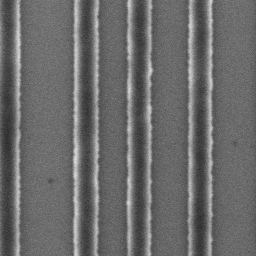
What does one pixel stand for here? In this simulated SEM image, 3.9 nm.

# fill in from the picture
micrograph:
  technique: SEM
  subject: lines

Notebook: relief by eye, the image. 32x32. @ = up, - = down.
@@-------@@@----@@@-----@@------
@@-------@@@----@@@-----@@------
@@-------@@@----@@@-----@@------
@@-------@@@----@@@-----@@------
@@-------@@@----@@@-----@@------
@@-------@@@----@@@-----@@------
@@-------@@@----@@@-----@@------
@@-------@@@----@@@-----@@------
@@-------@@@----@@@-----@@------
@@-------@@@----@@@-----@@------
@@-------@@@----@@@-----@@------
@@-------@@@----@@@-----@@------
@@-------@@@----@@@-----@@------
@@-------@@@----@@@-----@@------
@@-------@@@----@@@-----@@------
@@-------@@@----@@@-----@@------
@@-------@@@----@@@-----@@------
@@-------@@@----@@@-----@@------
@@-------@@@----@@@-----@@------
@@-------@@@----@@@-----@@------
@@-------@@@----@@@-----@@------
@@-------@@@----@@@-----@@------
@@-------@@@----@@@-----@@------
@@-------@@@----@@@-----@@------
@@-------@@@----@@@-----@@------
@@-------@@@----@@@-----@@------
@@-------@@@----@@@-----@@------
@@-------@@@----@@@-----@@------
@@-------@@@----@@@-----@@------
@@-------@@@----@@@-----@@------
@@-------@@@----@@@-----@@------
@@-------@@@----@@@-----@@------